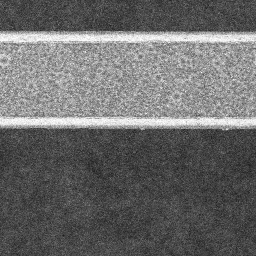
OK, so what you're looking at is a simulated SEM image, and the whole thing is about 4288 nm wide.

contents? one or a few lines or trenches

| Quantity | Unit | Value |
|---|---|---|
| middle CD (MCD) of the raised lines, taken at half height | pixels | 83.3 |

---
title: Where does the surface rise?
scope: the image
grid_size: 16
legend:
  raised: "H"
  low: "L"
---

LLLLLLLLLLLLLLLL
LLLLLLLLLLLLLLLL
HHHHHHHHHHHHHHHH
HHHHHHHHHHHHHHHH
HHHHHHHHHHHHHHHH
HHHHHHHHHHHHHHHH
HHHHHHHHHHHHHHHH
HHHHHHHHHHHHHHHH
LLLLLLLLLLLLLLLL
LLLLLLLLLLLLLLLL
LLLLLLLLLLLLLLLL
LLLLLLLLLLLLLLLL
LLLLLLLLLLLLLLLL
LLLLLLLLLLLLLLLL
LLLLLLLLLLLLLLLL
LLLLLLLLLLLLLLLL